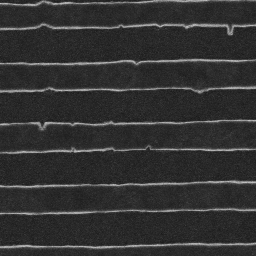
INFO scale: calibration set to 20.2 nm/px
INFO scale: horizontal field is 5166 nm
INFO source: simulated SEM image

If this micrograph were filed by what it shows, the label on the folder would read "parallel lines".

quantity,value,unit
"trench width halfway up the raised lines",674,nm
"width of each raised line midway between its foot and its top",552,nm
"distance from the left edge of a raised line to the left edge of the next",1230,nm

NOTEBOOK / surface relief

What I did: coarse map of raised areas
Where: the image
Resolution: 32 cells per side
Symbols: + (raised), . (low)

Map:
....++++++.+++++++++++++++++++++
++++++++++++++++++++++++++++++++
++++++++++++++++++++++++++++++++
++++...+.....++.............+...
................................
................................
................................
................................
++++++++++++++++++++++++++++++++
++++++++++++++++++++++++++++++++
++++++++++++++++++++++++++++++++
................................
................................
................................
................................
.++++.+++++..+++++++++++++++++++
++++++++++++++++++++++++++++++++
++++++++++++++++++++++++++++++++
++++++++++++++++++++++++++++++++
................................
................................
................................
................................
++++++++++++++++++++++++++++++++
++++++++++++++++++++++++++++++++
++++++++++++++++++++++++++++++++
++++++++++++....................
................................
................................
................................
.......................+++.....+
++++++++++++++++++++++++++++++++